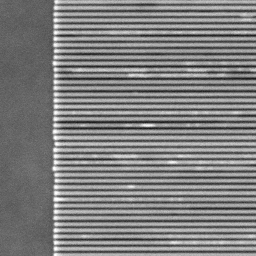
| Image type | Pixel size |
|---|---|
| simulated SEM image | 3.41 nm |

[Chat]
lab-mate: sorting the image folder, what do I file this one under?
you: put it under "parallel lines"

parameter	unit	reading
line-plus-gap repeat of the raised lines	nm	21.1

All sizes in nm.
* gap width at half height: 6.4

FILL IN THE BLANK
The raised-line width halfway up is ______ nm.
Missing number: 15.3